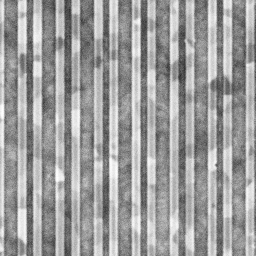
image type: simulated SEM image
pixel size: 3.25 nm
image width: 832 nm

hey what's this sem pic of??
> parallel lines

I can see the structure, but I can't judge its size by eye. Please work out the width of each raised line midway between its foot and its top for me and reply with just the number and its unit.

24.4 nanometers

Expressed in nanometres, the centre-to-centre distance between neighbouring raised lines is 61.7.